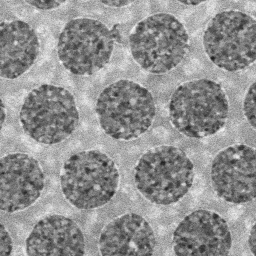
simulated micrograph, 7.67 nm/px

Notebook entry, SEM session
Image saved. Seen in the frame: raised bodies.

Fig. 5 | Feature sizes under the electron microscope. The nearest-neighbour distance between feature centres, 0.562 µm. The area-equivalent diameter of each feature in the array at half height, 0.462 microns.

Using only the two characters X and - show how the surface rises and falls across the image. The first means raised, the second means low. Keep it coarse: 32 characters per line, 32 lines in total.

----XXXX-----XXX-------XX-------
---------------------------XXX--
---------XXX------XXXX----XXXXXX
XXXX----XXXXXXX--XXXXXX---XXXXXX
XXXXX--XXXXXXXX-XXXXXXXX-XXXXXXX
XXXXX--XXXXXXX--XXXXXXXX-XXXXXXX
XXXXX--XXXXXXX--XXXXXXX---XXXXXX
XXXX---XXXXXXX---XXXXXX---XXXXXX
XXXX----XXXXX-----XXXX------XXX-
XX------------------------------
--------------XXX------XXXX----X
----XXXXX----XXXXXX---XXXXXX---X
---XXXXXX---XXXXXXX--XXXXXXX--XX
X--XXXXXXX--XXXXXXX--XXXXXXXX-XX
X-XXXXXXXX--XXXXXXX--XXXXXXX---X
X--XXXXXXX--XXXXXXX--XXXXXXX---X
---XXXXXX----XXXXX----XXXXX-----
----XXXX-------XX---------------
-------------------XXX------XXXX
XXXX-----XXXXX----XXXXX----XXXXX
XXXXX---XXXXXX---XXXXXXX--XXXXXX
XXXXX---XXXXXXX--XXXXXXX--XXXXXX
XXXXX---XXXXXXX--XXXXXXX--XXXXXX
XXXXX---XXXXXXX--XXXXXXX---XXXXX
XXXXX---XXXXXX----XXXXX----XXXXX
XXXX-----XXXX------XX--------X--
-X----------------------XXX-----
-----XXXX-----XXXX-----XXXXX----
X---XXXXXX---XXXXXX---XXXXXXX--X
X--XXXXXXX--XXXXXXX---XXXXXXX--X
XX-XXXXXXXX-XXXXXXX---XXXXXXX--X
X--XXXXXXXX--XXXXXX---XXXXXXX--X